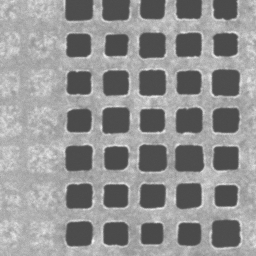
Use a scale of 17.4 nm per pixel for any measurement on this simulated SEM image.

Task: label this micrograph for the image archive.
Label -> a regular array of holes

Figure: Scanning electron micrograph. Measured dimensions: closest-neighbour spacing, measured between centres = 632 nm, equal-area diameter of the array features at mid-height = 488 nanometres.